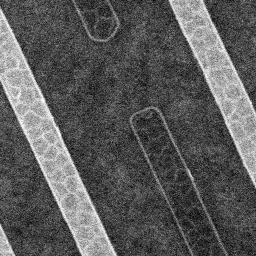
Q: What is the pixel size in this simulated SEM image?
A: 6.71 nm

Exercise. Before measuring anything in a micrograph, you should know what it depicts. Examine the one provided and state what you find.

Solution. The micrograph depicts one or a few lines or trenches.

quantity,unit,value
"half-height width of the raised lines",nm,191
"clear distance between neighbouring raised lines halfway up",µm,0.468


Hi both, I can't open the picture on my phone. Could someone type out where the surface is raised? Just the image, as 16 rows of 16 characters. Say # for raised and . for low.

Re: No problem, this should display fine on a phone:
.....##....##...
.....##....##...
#...........##..
#...........##..
##...........##.
##...........##.
.##...........##
.##.....##....##
..##.....##....#
..##.....##....#
...##....###...#
...##.....##....
....##....###...
....##.....##...
.....##....###..
#....##.....##..